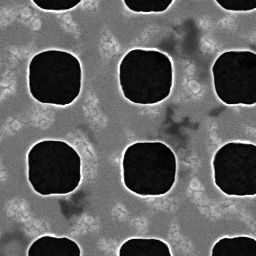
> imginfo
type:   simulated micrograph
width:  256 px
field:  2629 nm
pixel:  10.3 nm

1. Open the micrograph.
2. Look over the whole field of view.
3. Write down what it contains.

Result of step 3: holes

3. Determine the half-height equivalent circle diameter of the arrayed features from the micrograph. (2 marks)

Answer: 55.7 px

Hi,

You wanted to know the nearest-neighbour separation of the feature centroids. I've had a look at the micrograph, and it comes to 90.7 pixels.